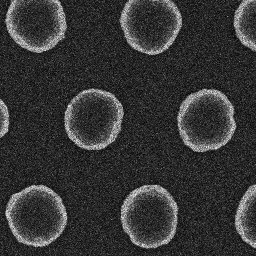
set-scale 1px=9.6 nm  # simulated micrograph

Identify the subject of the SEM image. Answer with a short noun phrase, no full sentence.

raised bodies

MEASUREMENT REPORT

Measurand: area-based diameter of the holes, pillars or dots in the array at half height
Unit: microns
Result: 0.536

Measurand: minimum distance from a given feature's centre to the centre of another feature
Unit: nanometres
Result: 1080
